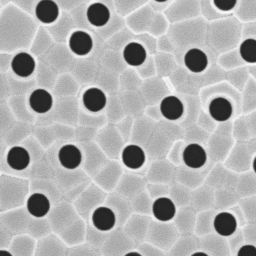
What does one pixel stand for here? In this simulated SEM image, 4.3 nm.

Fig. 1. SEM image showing a regular array of holes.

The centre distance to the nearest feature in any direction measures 51.7 px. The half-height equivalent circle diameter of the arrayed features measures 98.2 nanometres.